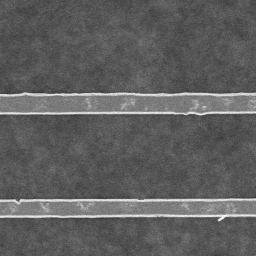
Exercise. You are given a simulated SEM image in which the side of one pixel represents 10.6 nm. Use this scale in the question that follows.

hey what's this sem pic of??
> one or a few lines or trenches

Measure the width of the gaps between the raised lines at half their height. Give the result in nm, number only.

929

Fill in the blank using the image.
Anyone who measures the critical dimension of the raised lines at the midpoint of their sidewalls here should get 176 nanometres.